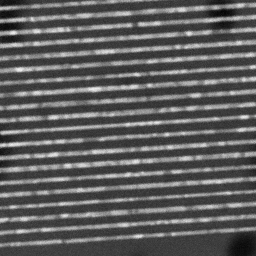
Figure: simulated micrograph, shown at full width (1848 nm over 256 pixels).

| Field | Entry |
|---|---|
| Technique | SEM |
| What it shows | parallel lines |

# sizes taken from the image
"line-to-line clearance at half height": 68.4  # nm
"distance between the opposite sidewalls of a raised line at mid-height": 21.6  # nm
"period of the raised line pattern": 89.6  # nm